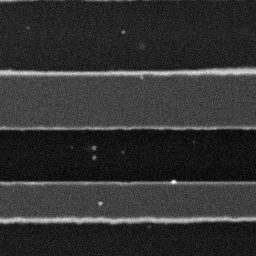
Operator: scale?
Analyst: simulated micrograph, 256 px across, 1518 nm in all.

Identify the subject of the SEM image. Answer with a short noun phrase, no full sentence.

lines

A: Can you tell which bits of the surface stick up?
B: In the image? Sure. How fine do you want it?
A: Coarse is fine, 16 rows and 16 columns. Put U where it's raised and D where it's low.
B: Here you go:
DDDDDDDDDDDDDDDD
DDDDDDDDDDDDDDDD
DDDDDDDDDDDDDDDD
DDDDDDDDDDDDDDDD
DDDDDDDDDDDDDDDD
UUUUUUUUUUUUUUUU
UUUUUUUUUUUUUUUU
UUUUUUUUUUUUUUUU
DDDDDDDDDDDDDDDD
DDDDDDDDDDDDDDDD
DDDDDDDDDDDDDDDD
UUUUUUUUUUUUUUUU
UUUUUUUUUUUUUUUU
UUUUUUUUUUUUUUUU
DDDDDDDDDDDDDDDD
DDDDDDDDDDDDDDDD